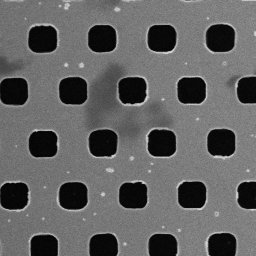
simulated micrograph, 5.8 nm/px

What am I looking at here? a regular array of holes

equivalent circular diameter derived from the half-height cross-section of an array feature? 170 nm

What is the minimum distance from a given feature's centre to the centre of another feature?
59.2 pixels